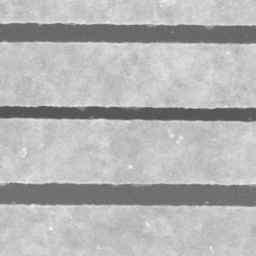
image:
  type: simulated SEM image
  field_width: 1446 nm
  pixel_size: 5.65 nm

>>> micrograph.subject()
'lines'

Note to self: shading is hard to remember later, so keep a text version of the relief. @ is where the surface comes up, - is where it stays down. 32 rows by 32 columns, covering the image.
@@@@@@@@@@@@@@@@@@@@@@@@@@@@@@@@
@@@@@@@@@@@@@@@@@@@@@@@@@@@@@@@@
@@@@@@@@@@@@@@@@@@@@@@@@@@@@@@@@
--------------------------------
--------------------------------
@@@@@@@@@@@@@@@@@@@@@@@@@@@-----
@@@@@@@@@@@@@@@@@@@@@@@@@@@@@@@@
@@@@@@@@@@@@@@@@@@@@@@@@@@@@@@@@
@@@@@@@@@@@@@@@@@@@@@@@@@@@@@@@@
@@@@@@@@@@@@@@@@@@@@@@@@@@@@@@@@
@@@@@@@@@@@@@@@@@@@@@@@@@@@@@@@@
@@@@@@@@@@@@@@@@@@@@@@@@@@@@@@@@
@@@@@@@@@@@@@@@@@@@@@@@@@@@@@@@@
-----------------------@@@@-----
--------------------------------
@@@@@@@@@@@@@@@@@@@@@@@@@@@@@@@@
@@@@@@@@@@@@@@@@@@@@@@@@@@@@@@@@
@@@@@@@@@@@@@@@@@@@@@@@@@@@@@@@@
@@@@@@@@@@@@@@@@@@@@@@@@@@@@@@@@
@@@@@@@@@@@@@@@@@@@@@@@@@@@@@@@@
@@@@@@@@@@@@@@@@@@@@@@@@@@@@@@@@
@@@@@@@@@@@@@@@@@@@@@@@@@@@@@@@@
@@@@@@@@@@@@@@@@@@@@@@@@@@@@@@@@
--------------------------------
--------------------------------
--------------------------------
@@@@@@@@@@@@@@@@@@@@@@@@@@@@@@@@
@@@@@@@@@@@@@@@@@@@@@@@@@@@@@@@@
@@@@@@@@@@@@@@@@@@@@@@@@@@@@@@@@
@@@@@@@@@@@@@@@@@@@@@@@@@@@@@@@@
@@@@@@@@@@@@@@@@@@@@@@@@@@@@@@@@
@@@@@@@@@@@@@@@@@@@@@@@@@@@@@@@@